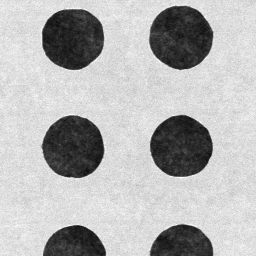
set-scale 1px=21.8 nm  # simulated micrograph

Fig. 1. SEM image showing holes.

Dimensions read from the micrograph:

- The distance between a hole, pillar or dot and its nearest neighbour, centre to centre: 2360 nm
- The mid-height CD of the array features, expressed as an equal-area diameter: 1370 nanometers